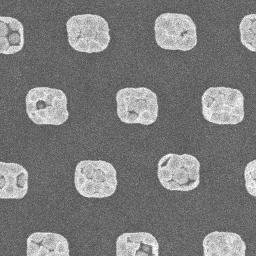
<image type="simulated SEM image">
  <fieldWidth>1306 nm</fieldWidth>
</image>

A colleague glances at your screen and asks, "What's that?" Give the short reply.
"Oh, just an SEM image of raised bodies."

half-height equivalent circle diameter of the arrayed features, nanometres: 204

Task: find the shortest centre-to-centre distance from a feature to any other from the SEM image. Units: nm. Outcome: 423